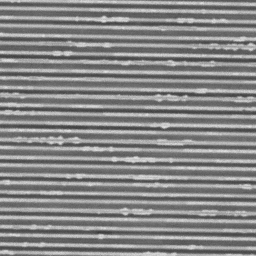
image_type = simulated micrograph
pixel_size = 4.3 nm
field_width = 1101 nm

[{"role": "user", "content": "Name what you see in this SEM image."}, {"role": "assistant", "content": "parallel lines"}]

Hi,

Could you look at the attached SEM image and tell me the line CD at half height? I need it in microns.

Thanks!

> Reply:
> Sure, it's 0.0161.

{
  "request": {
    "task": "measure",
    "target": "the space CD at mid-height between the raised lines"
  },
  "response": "19.9 nm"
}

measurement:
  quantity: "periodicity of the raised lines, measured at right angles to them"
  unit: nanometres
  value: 37.5